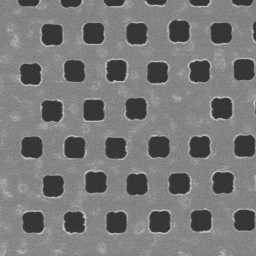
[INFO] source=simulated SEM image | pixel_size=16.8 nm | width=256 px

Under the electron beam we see a regular array of holes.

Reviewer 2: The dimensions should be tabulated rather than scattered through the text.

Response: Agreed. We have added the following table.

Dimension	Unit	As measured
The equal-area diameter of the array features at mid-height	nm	382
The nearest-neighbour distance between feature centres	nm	700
